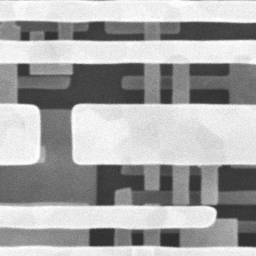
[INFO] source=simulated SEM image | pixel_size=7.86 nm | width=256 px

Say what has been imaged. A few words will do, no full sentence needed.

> wiring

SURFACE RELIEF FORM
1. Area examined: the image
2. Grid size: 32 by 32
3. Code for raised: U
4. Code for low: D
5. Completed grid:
UUUUUUUUUUUUUUUUUUUUUUUUUUUUUUUU
UUUUUUUUUUUUUUUUUUUUUUUUUUUUUUUU
UUUUUUUUUUUUUUUUUUUUUUUUUUUUUUUU
UUDDDDDUUDDDDDDDDDUUDDDDDDDDDDDD
UUDDUDDUUDDDDDDDDDUUDDDDDDDDDDDD
UUUUUUUUUUUUUUUUUUUUUUUUUUUUUUUU
UUUUUUUUUUUUUUUUUUUUUUUUUUUUUUUU
UUUUUUUUUUUUUUUUUUUUUUUUUUUUUUUU
UUDDUUUUUDDDDDDDDDUUDDUUDDDDDDDD
UUDDDDDDDDDDDDDDDDUUDDUUDDDDDDDD
UUDDDDDDDDDDDDDDDDUUDDUUDDDDDDDD
UUDDDDDDDDDDDDDDDDUUDDUUDDDDDDDD
UUDDDDDDDDDDDDDDDDUUDDUUDDDDDDDD
UUUUUDDDDUUUUUUUUUUUUUUUUUUUUUUU
UUUUUDDDDUUUUUUUUUUUUUUUUUUUUUUU
UUUUUDDDDUUUUUUUUUUUUUUUUUUUUUUU
UUUUUDDDDUUUUUUUUUUUUUUUUUUUUUUU
UUUUUDDDDUUUUUUUUUUUUUUUUUUUUUUU
UUUUUDDDDUUUUUUUUUUUUUUUUUUUUUUU
UUUUUUDDDUUUUUUUUUUUUUUUUUUUUUUU
UUUUDDDDDDUUUUUUUUUUUUUUUUUUUUUU
DDDDDDDDDDDDDDDDDDUUDDUUDUUDDDDD
DDDDDDDDDDDDDDDDDDUUDDUUDUUDDDDD
DDDDDDDDDDDDDDDDDDUUDDUUDUUDDDDD
DDDDDDDDDDDDDDUUDDDDDDUUDUUDDDDD
UUUUUUUUUUUDDDUUUDUDDDUUDUUDDDDD
UUUUUUUUUUUUUUUUUUUUUUUUUUUDDDDD
UUUUUUUUUUUUUUUUUUUUUUUUUUUUUDDD
UUUUUUUUUUUUDDUUUUUUDDUUUUUUUUDD
UUUUUUUUUUUDDDUUDDUUDDDUUUUUUUDD
UUUUUUUUUUUDDDUUUDUUDDDUUUUUUUDD
UUUUUUUUUUUUUUUUUUUUUUUUUUUUUUUU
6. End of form